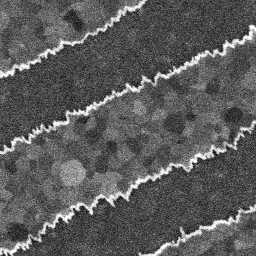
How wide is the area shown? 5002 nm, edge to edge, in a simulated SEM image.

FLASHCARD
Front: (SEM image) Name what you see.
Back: one or a few lines or trenches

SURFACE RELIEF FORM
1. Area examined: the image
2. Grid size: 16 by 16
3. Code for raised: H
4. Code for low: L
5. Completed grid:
HHHHHHHHLLLLLLLL
HHHHHHHLLLLLLLLL
HHHHHLLLLLLLLLLH
HHHLLLLLLLLLHHHH
HLLLLLLLLLLHHHHH
LLLLLLLLHHHHHHHH
LLLLLLHHHHHHHHHH
LLLLHHHHHHHHHHHH
LLHHHHHHHHHHHHHL
HHHHHHHHHHHHHHLL
HHHHHHHHHHHLLLLL
HHHHHHHHHLLLLLLL
HHHHHHLLLLLLLLLL
HHHHLLLLLLLLLLLH
HHHLLLLLLLLLHHHH
HLLLLLLLLLHHHHHH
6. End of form